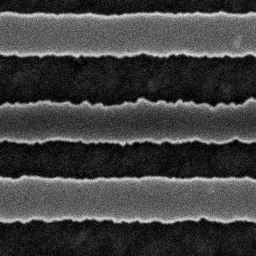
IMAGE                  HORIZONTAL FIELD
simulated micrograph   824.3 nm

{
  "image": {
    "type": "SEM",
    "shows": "lines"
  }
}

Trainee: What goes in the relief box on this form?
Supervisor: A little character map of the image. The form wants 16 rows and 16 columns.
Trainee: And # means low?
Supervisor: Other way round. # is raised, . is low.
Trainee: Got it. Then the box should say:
................
################
################
.#...#.#....###.
................
................
######..#####.##
################
################
................
................
################
################
################
................
................